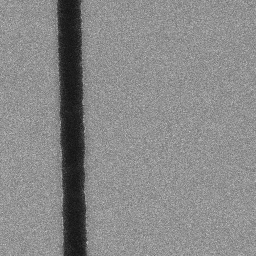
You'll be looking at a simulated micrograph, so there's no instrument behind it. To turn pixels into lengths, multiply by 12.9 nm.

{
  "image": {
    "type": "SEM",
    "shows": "one or a few lines or trenches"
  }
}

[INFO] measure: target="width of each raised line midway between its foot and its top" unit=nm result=321